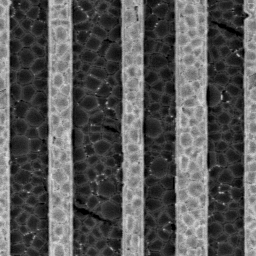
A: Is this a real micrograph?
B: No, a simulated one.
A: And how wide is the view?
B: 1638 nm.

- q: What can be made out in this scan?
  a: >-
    one or a few lines or trenches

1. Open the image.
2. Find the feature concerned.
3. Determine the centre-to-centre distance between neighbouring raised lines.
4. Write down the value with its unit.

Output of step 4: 418 nm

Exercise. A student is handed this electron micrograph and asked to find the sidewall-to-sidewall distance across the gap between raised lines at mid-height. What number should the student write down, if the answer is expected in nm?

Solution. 257